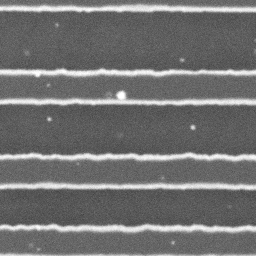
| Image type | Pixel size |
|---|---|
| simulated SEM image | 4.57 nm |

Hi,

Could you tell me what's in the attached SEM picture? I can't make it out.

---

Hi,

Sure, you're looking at lines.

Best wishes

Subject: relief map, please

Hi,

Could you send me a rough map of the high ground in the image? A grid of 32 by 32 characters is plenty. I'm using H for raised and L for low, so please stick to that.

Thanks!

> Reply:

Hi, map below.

HHHHHHHHHHHHHHHHHHHHHHHHHHHHHHHH
LLLLLLLLLLLLLLLLLLLLLLLLLLLLLLLL
LLLLLLLLLLLLLLLLLLLLLLLLLLLLLLLL
LLLLLLLLLLLLLLLLLLLLLLLLLLLLLLLL
LLLLLLLLLLLLLLLLLLLLLLLLLLLLLLLL
LLLLLLLLLLLLLLLLLLLLLLLLLLLLLLLL
LLLLLLLLLLLLLLLLLLLLLLLLLLLLLLLL
LLLLLLLLLLLLLLLLLLLLLLLLLLLLLLLL
LLLLLLLLLLLLLLLLLLLLLLLLLLLLLLLL
HHHHHHHHHHHHHHHHHHHHHHHHHHHHHHHH
HHHHHHHHHHHHHHHHHHHHHHHHHHHHHHHH
HHHHHHHHHHHHHHHHHHHHHHHHHHHHHHHH
HHHHHHHHHHHHHHHHHHHHHHHHHHHHHHHH
LLLLLLLLLLLLLLLLLLLLLLLLLLLLLLLL
LLLLLLLLLLLLLLLLLLLLLLLLLLLLLLLL
LLLLLLLLLLLLLLLLLLLLLLLLLLLLLLLL
LLLLLLLLLLLLLLLLLLLLLLLLLLLLLLLL
LLLLLLLLLLLLLLLLLLLLLLLLLLLLLLLL
LLLLLLLLLLLLLLLLLLLLLLLLLLLLLLLL
LLLHHLLLLLHLLLLLHLLLLLLHHLLLLLLL
HHHHHHHHHHHHHHHHHHHHHHHHHHHHHHHH
HHHHHHHHHHHHHHHHHHHHHHHHHHHHHHHH
HHHHHHHHHHHHHHHHHHHHHHHHHHHHHHHH
LLLLLLLLLLLLLLLLLLLLLLLLLLLLLLLH
LLLLLLLLLLLLLLLLLLLLLLLLLLLLLLLL
LLLLLLLLLLLLLLLLLLLLLLLLLLLLLLLL
LLLLLLLLLLLLLLLLLLLLLLLLLLLLLLLL
LLLLLLLLLLLLLLLLLLLLLLLLLLLLLLLL
HHHHHHHHHHHHLHHLLHHHHHHLHHLLLLHH
HHHHHHHHHHHHHHHHHHHHHHHHHHHHHHHH
HHHHHHHHHHHHHHHHHHHHHHHHHHHHHHHH
HHHHHHHHHHHHHHHHHHHHHHHHHHHHHHHH